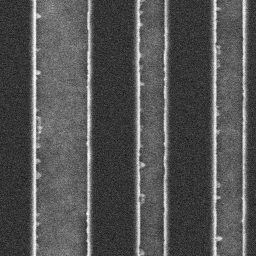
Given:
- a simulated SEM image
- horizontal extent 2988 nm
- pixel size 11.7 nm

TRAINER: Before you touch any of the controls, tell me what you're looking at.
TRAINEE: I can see lines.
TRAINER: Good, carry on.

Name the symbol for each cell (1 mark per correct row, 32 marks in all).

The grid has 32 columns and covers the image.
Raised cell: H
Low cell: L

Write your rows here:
HHHHLLLLLLLHHHHHHLLLLHHHHHHLLLHH
HHHHLLLLLLLHHHHHHLLLLHHHHHHLLLHH
HHHHLLLLLLLHHHHHHLLLLHHHHHHLLLHH
HHHHLLLLLLLHHHHHHLLLLHHHHHHLLLHH
HHHHLLLLLLLHHHHHHLLLLHHHHHHLLLHH
HHHHLLLLLLLHHHHHHLLLLHHHHHHLLLHH
HHHHLLLLLLLHHHHHHLLLLHHHHHHLLLHH
HHHHLLLLLLLHHHHHHLLLLHHHHHHLLLHH
HHHHLLLLLLLHHHHHHLLLLHHHHHHLLLHH
HHHHLLLLLLLHHHHHHLLLLHHHHHHLLLHH
HHHHLLLLLLLHHHHHHLLLLHHHHHHLLLHH
HHHHLLLLLLLHHHHHHLLLLHHHHHHLLLHH
HHHHLLLLLLLHHHHHHLLLLHHHHHHLLLHH
HHHHLLLLLLLHHHHHHLLLLHHHHHHLLLHH
HHHHLLLLLLLHHHHHHLLLLHHHHHHLLLHH
HHHHLLLLLLLHHHHHHLLLLHHHHHHLLLHH
HHHHLLLLLLLHHHHHHLLLLHHHHHHLLLHH
HHHHLLLLLLLHHHHHHLLLLHHHHHHLLLHH
HHHHLLLLLLLHHHHHHLLLLHHHHHHLLLHH
HHHHLLLLLLLHHHHHHLLLLHHHHHHLLLHH
HHHHLLLLLLLHHHHHHLLLLHHHHHHLLLHH
HHHHLLLLLLLHHHHHHLLLLHHHHHHLLLHH
HHHHLLLLLLLHHHHHHLLLLHHHHHHLLLHH
HHHHLLLLLLLHHHHHHLLLLHHHHHHLLLHH
HHHHLLLLLLLHHHHHHLLLLHHHHHHLLLHH
HHHHLLLLLLLHHHHHHLLLLHHHHHHLLLHH
HHHHLLLLLLLHHHHHHLLLLHHHHHHLLLHH
HHHHLLLLLLLHHHHHHLLLLHHHHHHLLLHH
HHHHLLLLLLLHHHHHHLLLLHHHHHHLLLHH
HHHHLLLLLLLHHHHHHLLLLHHHHHHLLLHH
HHHHLLLLLLLHHHHHHLLLLHHHHHHLLLHH
HHHHLLLLLLLHHHHHHLLLLHHHHHHLLLHH